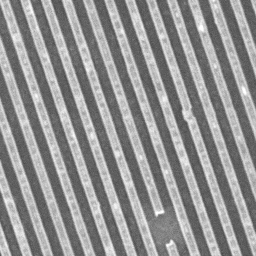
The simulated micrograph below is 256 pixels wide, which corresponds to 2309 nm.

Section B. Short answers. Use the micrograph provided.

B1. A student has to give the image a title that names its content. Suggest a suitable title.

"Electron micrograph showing parallel lines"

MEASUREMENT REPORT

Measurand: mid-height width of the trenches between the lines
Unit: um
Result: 0.11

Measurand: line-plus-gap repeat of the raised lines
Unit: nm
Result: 179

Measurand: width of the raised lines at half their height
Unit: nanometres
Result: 68.3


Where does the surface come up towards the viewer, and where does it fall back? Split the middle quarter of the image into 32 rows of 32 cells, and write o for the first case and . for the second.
oo...oo...ooo...oo...oo...oo...o
oo....oo...oo...oo...oo....oo...
.oo...oo...oo...ooo...oo...oo...
.oo...oo...ooo...oo...oo...oo...
.oo....oo...oo...oo...oo....oo..
..oo...oo...oo...ooo...oo...oo..
..oo...oo...ooo...oo...oo...oo..
..oo....oo...oo...oo...oo....oo.
...oo...oo...oo...ooo...oo...oo.
...oo...oo...ooo...oo...oo...oo.
...oo....oo...oo...oo...oo....oo
o...oo...oo...oo...ooo...oo...o.
o...oo...ooo..ooo...oo...oo...oo
o...oo....oo...oo...oo...oo...oo
oo...oo...oo...oo....oo...oo...o
oo...oo...ooo...oo...oo...oo...o
oo...ooo...oo...oo...oo...oo....
ooo...oo...oo...oo....oo...oo...
.oo...oo...oo....oo...oo...oo...
.oo...oo....oo...oo...oo...oo...
..oo...oo...oo...oo...ooo...oo..
..oo...oo...oo....oo...oo...oo..
..oo...oo....oo...oo...oo....o..
...oo...oo...oo...oo....oo...oo.
...oo...oo...oo....oo...oo...oo.
...oo...oo....oo...oo...oo....o.
...ooo...oo...oo...oo...ooo...oo
o...oo...oo...oo....oo...oo...oo
o...oo....o....oo...oo...oo....o
o...ooo...oo...oo...oo...ooo...o
oo...oo...oo...oo....oo...oo...o
oo...oo....o....oo...oo...oo....